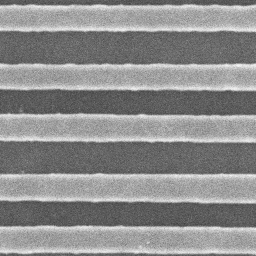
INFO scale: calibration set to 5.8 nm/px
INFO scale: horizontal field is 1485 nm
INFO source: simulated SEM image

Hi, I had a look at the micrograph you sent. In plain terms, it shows lines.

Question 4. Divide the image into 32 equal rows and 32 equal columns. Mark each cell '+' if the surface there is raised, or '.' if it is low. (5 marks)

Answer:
................................
++++++++++++++++++++++++++++++++
++++++++++++++++++++++++++++++++
++++++++++++++++++++++++++++++++
................................
................................
................................
................................
++++++++++++++++++++++++++++++++
++++++++++++++++++++++++++++++++
++++++++++++++++++++++++++++++++
................................
................................
................................
++++++++++++++++++++++++++++++++
++++++++++++++++++++++++++++++++
++++++++++++++++++++++++++++++++
+.+..+++++++++++++++++++++++++++
................................
................................
................................
................................
++++++++++++++++++++++++++++++++
++++++++++++++++++++++++++++++++
++++++++++++++++++++++++++++++++
................................
................................
................................
++++++++++++++++++++++++++++....
++++++++++++++++++++++++++++++++
++++++++++++++++++++++++++++++++
++++++++++++++++++++++++++++++++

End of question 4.